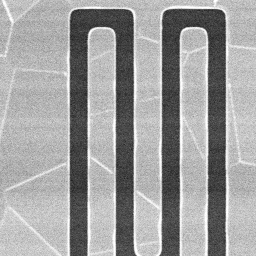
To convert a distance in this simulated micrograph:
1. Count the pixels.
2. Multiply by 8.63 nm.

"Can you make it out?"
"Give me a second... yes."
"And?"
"groups of lines, slits or small figures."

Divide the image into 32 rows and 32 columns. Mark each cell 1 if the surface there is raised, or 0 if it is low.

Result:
11111111111111111111111111111111
11111111100000001111000000001111
11111111100000000111000000001111
11111111100000000111000000001111
11111111100111000111000111001111
11111111100111000111000111001111
11111111100111000111000111001111
11111111100111000111000111001111
11111111100111000111000111001111
11111111100111000111000111001111
11111111100111000111000111001111
11111111100111000111000111001111
11111111100111000111000111001111
11111111100111000111000111001111
11111111100111000111000111001111
11111111100111000111000111001111
11111111100111000111000111001111
11111111100111000111000111001111
11111111100111000111000111001111
11111111100111000111000111001111
11111111100111000111000111001111
11111111100111000111000111001111
11111111100111000111000111001111
11111111100111000111000111001111
11111111100111000111000111001111
11111111100111000111000111001111
11111111100111000111000111001111
11111111100111000111000111001111
11111111100111000111000111001111
11111111100111000111000111001111
11111111100111000111000111001111
11111111100111000111000111001111